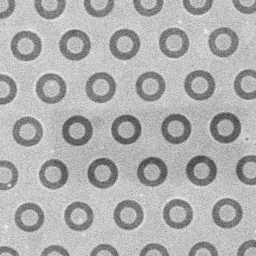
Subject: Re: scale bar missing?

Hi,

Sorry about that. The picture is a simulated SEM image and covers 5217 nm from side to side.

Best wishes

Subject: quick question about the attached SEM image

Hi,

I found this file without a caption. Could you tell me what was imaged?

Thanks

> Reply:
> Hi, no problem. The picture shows an array of small figures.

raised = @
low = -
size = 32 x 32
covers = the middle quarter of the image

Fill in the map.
@@@@@@@@@@@@@@@@@@@@@@@@@@@@@@@@
@@@@@@@@@@@@@@@@@@@@@@@@@@@@@@@@
@@@@@@@----@@@@@@@@-----@@@@@@@-
@@@@@@------@@@@@@-------@@@@@--
@@@@@@--@@@--@@@@@--@@@--@@@@@--
-@@@@--@@@@--@@@@@--@@@--@@@@@--
-@@@@--@@@@--@@@@@--@@@--@@@@@--
-@@@@@---@---@@@@@-------@@@@@@-
@@@@@@------@@@@@@@-----@@@@@@@-
@@@@@@@----@@@@@@@@@@-@@@@@@@@@@
@@@@@@@@@@@@@@@@@@@@@@@@@@@@@@@@
@@@@@@@@@@@@@@@@@@@@@@@@@@@@@@@@
@@@@@@@@@@@@@@@@@@@@@@@@@@@--@@@
@-----@@@@@@@-----@@@@@@@------@
-------@@@@@-------@@@@@@--@@---
--@@@--@@@@@--@@@--@@@@@--@@@@--
--@@@--@@@@@--@@@---@@@@--@@@@--
--@@@--@@@@@--@@@--@@@@@---@@---
-------@@@@@-------@@@@@@------@
@-----@@@@@@@-----@@@@@@@@----@@
@@--@@@@@@@@@@@@@@@@@@@@@@@@@@@@
@@@@@@@@@@@@@@@@@@@@@@@@@@@@@@@@
@@@@@@@@@@@@@@@@@@@@@@@@@@@@@@@@
@@@@@@@@@--@@@@@@@@@@---@@@@@@@@
@@@@@@@-----@@@@@@@------@@@@@@-
-@@@@@---@---@@@@@@--@@---@@@@@-
-@@@@@--@@@---@@@@--@@@@--@@@@--
-@@@@@--@@@@--@@@@--@@@@--@@@@--
-@@@@@--@@@---@@@@---@@---@@@@@-
-@@@@@-------@@@@@@------@@@@@@@
@@@@@@@-----@@@@@@@@---@@@@@@@@@
@@@@@@@@@@@@@@@@@@@@@@@@@@@@@@@@